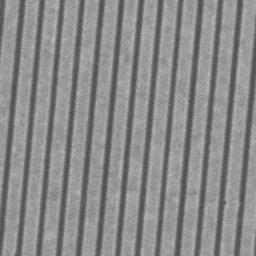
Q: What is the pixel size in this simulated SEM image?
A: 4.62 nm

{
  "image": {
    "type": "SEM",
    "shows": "parallel lines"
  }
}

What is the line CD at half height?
58.6 nm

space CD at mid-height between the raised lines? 31.6 nanometers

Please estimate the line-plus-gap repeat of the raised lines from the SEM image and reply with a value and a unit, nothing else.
91.1 nm